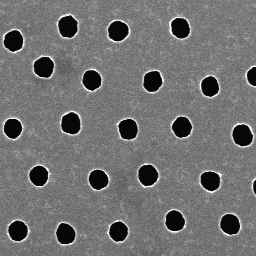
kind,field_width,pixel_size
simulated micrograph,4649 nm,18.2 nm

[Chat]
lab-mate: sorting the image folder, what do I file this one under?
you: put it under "a regular array of holes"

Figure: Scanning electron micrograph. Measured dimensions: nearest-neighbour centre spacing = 899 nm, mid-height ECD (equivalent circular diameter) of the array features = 364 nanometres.